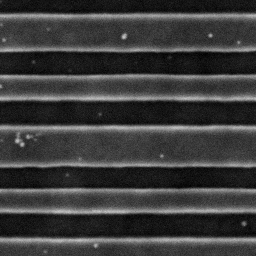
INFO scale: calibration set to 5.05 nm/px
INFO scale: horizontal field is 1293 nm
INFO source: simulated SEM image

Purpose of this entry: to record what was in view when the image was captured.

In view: lines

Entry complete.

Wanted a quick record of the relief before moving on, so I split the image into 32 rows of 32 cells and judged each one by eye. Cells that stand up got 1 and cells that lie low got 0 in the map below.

00000000000000000000000000000000
00000000000000000000000000000000
11111111111111111111111111111111
11111111111111111111111111111111
11111111111111111111111111111111
11111111111111111111111111111111
00000000000000000000000000000000
00000000000000000000000000000000
00000000000000000000000000000000
11100000000011111111111110111111
11111111111111111111111111111111
11111111111111111111111111111111
00000000000000000000000000000000
00000000000000000000000000000000
00000000000000000000000000000000
00000000000000000000000000000000
11111111111111111111111111111111
11111111111111111111111111111111
11111111111111111111111111111111
11111111111111111111111111111111
11111111111111111111111111111111
00000000000000000000000000000000
00000000000000000000000000000000
00000000000000000000000000000000
11111111111111111111111111111111
11111111111111111111111111111111
00000011111111110000000000000000
00000000000000000000000000000000
00000000000000000000000000000000
00000000000000000000000000000000
11111111111111111111111111111111
11111111111111111111111111111111